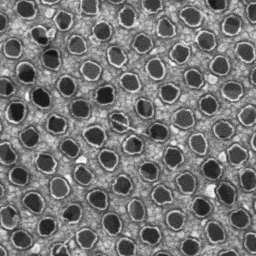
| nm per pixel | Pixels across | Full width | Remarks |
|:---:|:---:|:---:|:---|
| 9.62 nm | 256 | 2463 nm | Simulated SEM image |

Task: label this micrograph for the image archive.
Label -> a regular array of raised bodies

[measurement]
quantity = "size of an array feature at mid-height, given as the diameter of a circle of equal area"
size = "184 nm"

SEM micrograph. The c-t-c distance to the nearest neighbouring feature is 0.268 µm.